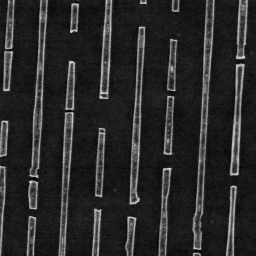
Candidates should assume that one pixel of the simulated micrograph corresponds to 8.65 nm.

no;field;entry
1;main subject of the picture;parallel lines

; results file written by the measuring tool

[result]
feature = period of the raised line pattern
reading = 287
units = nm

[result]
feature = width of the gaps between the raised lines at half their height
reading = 0.228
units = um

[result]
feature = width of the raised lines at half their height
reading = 52.9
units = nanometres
